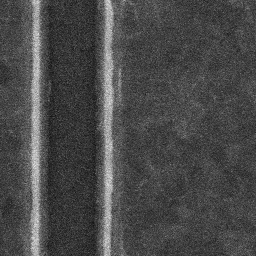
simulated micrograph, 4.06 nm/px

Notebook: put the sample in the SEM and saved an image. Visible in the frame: one or a few lines or trenches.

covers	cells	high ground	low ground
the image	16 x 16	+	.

++.....+++++++++
++.....+++++++++
++.....+++++++++
++.....+++++++++
++.....+++++++++
++.....+++++++++
++.....+++++++++
++.....+++++++++
++.....+++++++++
++.....+++++++++
++.....+++++++++
++.....+++++++++
++.....+++++++++
++.....+++++++++
++.....+++++++++
++.....+++++++++